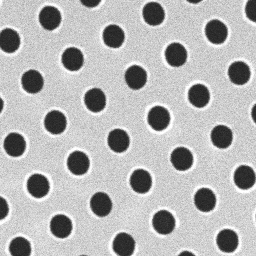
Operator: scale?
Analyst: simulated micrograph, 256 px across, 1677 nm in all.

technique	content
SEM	a regular array of holes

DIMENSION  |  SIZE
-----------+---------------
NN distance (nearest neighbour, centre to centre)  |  302 nm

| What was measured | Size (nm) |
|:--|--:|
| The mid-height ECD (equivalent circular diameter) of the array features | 155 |